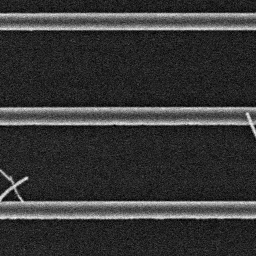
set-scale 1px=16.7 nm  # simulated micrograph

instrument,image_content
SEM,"lines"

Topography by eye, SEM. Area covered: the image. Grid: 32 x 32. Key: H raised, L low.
LLLLLLLLLLLLLLLLLLLLLLLLLLLLLLLL
LLLLLLLLLLLLLLLLLLLLLLLLLLLLLLLL
HHHHHHHHHHHHHHHHHHHHHHHHHHHHHHHH
HHHHHHHHHHHHHHHHHHHHHHHHHHHHHHHH
LLLLLLLLLLLLLLLLLLLLLLLLLLLLLLLL
LLLLLLLLLLLLLLLLLLLLLLLLLLLLLLLL
LLLLLLLLLLLLLLLLLLLLLLLLLLLLLLLL
LLLLLLLLLLLLLLLLLLLLLLLLLLLLLLLL
LLLLLLLLLLLLLLLLLLLLLLLLLLLLLLLL
LLLLLLLLLLLLLLLLLLLLLLLLLLLLLLLL
LLLLLLLLLLLLLLLLLLLLLLLLLLLLLLLL
LLLLLLLLLLLLLLLLLLLLLLLLLLLLLLLL
LLLLLLLLLLLLLLLLLLLLLLLLLLLLLLLL
LHHLHHLLHHHHHHHHHHHHHHHHHHHHHHHH
HHHHHHHHHHHHHHHHHHHHHHHHHHHHHHHH
HHHHHHHHHHHHHHHHHHHHHHHHHHHHHHHH
LLLLLLLLLLLLLLLLLLLLLLLLLLLLLLLL
LLLLLLLLLLLLLLLLLLLLLLLLLLLLLLLL
LLLLLLLLLLLLLLLLLLLLLLLLLLLLLLLL
LLLLLLLLLLLLLLLLLLLLLLLLLLLLLLLL
LLLLLLLLLLLLLLLLLLLLLLLLLLLLLLLL
LLLLLLLLLLLLLLLLLLLLLLLLLLLLLLLL
LLLLLLLLLLLLLLLLLLLLLLLLLLLLLLLL
LLLLLLLLLLLLLLLLLLLLLLLLLLLLLLLL
LLLLLLLLLLLLLLLLLLLLLLLLLLLLLLLL
HHHHHHHHHHHHHHHHHHHHHHHHHHHHHHHH
HHHHHHHHHHHHHHHHHHHHHHHHHHHHHHHH
LLLLLLLLLLLLLLLLLLLLLLLLLLLLLLLL
LLLLLLLLLLLLLLLLLLLLLLLLLLLLLLLL
LLLLLLLLLLLLLLLLLLLLLLLLLLLLLLLL
LLLLLLLLLLLLLLLLLLLLLLLLLLLLLLLL
LLLLLLLLLLLLLLLLLLLLLLLLLLLLLLLL